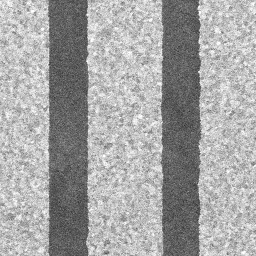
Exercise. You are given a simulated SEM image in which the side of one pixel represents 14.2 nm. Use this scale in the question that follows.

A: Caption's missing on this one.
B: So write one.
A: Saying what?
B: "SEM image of one or a few lines or trenches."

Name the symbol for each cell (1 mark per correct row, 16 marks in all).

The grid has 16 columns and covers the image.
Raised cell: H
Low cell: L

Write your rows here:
HHHLLHHHHHLLHHHH
HHHLLHHHHHLLLHHH
HHHLLLHHHHLLHHHH
HHHLLHHHHHLLLHHH
HHHLLLHHHHLLLHHH
HHHLLLHHHHLLLHHH
HHHLLLHHHHLLHHHH
HHHLLLHHHHLLLHHH
HHHLLLHHHHLLLHHH
HHHLLLHHHHLLHHHH
HHHLLLHHHHLLHHHH
HHHLLHHHHHLLHHHH
HHHLLHHHHHLLLHHH
HHHLLLHHHHLLLHHH
HHHLLLHHHHLLHHHH
HHHLLHHHHHLLHHHH